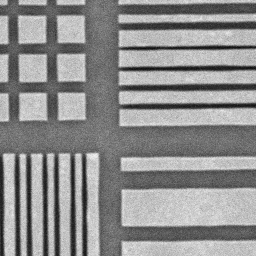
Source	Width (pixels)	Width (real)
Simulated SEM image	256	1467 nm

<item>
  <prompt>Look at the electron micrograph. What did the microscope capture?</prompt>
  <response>groups of lines, slits or small figures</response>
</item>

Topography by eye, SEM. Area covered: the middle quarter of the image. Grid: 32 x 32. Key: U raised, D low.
UUUUUDDDDDDDDDUUUUUDDDDUUDDDDDDD
UUUUUDDDDDDDDDDDDDDDDDDDDDDDDDDD
UUUUUDDDDDDDDDUUUUUUUUUUUUUUUUUU
UUUUUDDDDDDDDDUUUUUUUUUUUUUUUUUU
DDDDDDDDDDDDDDUUUUUUUUUUUUUUUUUU
DDDDDDDDDDDDDDDDDDDDDDDDDDDDDDDD
DDDDDDDDDDDDDDDDDDDDDDDDDDDDDDDD
UUUUUDDDDDDDDDUUUUUUUUUUUUUUUUUU
UUUUUDDDDDDDDDUUUUUUUUUUUUUUUUUU
UUUUUDDDDDDDDDUUUUUUUUUUUUUUUUUU
UUUUUDDDDDDDDDDDDDDDDDDDDDDDDDDD
UUUUUDDDDDDDDDDDDDDDDDDDDDDDDUUD
UUUUUDDDDDDDDDUUUUUUUUUUUUUUUUUU
UUUUUDDDDDDDDDUUUUUUUUUUUUUUUUUU
DDDDDDDDDDDDDDUUUUUUUUUUUUUUUUUU
DDDDDDDDDDDDDDDDDDDDDDDDDDDDDDDD
DDDDDDDDDDDDDDDDDDDDDDDDDDDDDDDD
DDDDDDDDDDDDDDDDDDDDDDDDDDDDDDDD
DDDDDDDDDDDDDDDDDDDDDDDDDDDDDDDD
DDDDDDDDDDDDDDDDDDDDDDDDDDDDDDDD
DDDDDDDDDDDDDDDDDDDDDDDDDDDDDDDD
DDDDDDDDDDDDDDDDDDDDDDDDDDDDDDDD
DDDDDDUUDDDDDDDDDDDDDDDDDDDDDDDD
UDDUDDUUDDDDDDDDDDDDDDDDDDDDDDDD
UDDUDDUUDDDDDDDUUUUUUUUUUUUUUUUU
UDDUDDUUDDDDDDDUUUUUUUUUUUUUUUUU
UDDUDDUUDDDDDDDUUUUUUUUDDDDDDDDD
UDDUDDUUDDDDDDDDDDDDDDDDDDDDDDDD
UDDUDDUUDDDDDDDDDDDDDDDDDDDDDDDD
UDDUDDUUDDDDDDDDDDDDDDDDDDDDDDDD
UUDUDDUUDDDDDDDDDDDDDDDDDDDDDDDD
UUDUDDUUDDDDDDDDDDDDDDDDDDDDDDUU